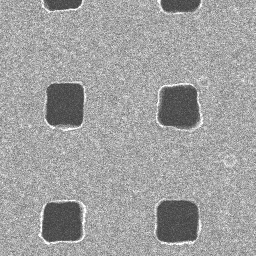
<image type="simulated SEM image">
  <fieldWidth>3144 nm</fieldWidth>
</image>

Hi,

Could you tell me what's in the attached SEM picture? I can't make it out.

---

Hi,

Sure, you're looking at holes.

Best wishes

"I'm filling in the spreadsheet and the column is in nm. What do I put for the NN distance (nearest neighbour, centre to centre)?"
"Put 1400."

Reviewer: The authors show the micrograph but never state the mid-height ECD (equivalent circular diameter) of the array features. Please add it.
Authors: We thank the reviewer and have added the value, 541 nanometers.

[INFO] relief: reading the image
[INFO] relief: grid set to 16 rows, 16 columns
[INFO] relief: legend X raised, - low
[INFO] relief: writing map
XXX--XXXXX--XXXX
XXXXXXXXXXXXXXXX
XXXXXXXXXXXXXXXX
XXXXXXXXXXXXXXXX
XXXXXXXXXXXXXXXX
XXX--XXXXX--XXXX
XXX--XXXXX--XXXX
XXX--XXXXX--XXXX
XXXXXXXXXXXXXXXX
XXXXXXXXXXXXXXXX
XXXXXXXXXXXXXXXX
XXXXXXXXXXXXXXXX
XXXXXXXXXXXXXXXX
XXX--XXXXX--XXXX
XXX--XXXXX--XXXX
XXXXXXXXXXXXXXXX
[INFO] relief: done